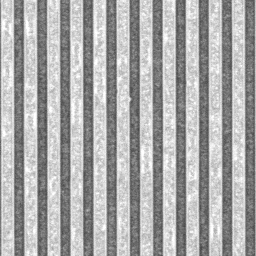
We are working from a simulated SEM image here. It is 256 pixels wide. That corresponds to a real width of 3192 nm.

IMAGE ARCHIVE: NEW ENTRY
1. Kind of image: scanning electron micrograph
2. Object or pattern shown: parallel lines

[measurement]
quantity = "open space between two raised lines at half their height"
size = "137 nm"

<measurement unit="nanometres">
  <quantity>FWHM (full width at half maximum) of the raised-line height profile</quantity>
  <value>148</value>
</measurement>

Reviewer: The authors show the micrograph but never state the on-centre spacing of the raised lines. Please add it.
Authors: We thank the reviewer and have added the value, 288 nm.